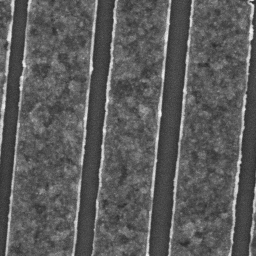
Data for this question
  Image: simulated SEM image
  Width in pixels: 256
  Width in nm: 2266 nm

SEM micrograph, one or a few lines or trenches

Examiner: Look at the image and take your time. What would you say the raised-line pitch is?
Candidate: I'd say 79.7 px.